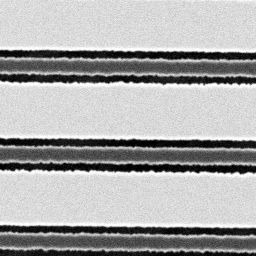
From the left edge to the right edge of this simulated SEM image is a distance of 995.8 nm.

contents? lines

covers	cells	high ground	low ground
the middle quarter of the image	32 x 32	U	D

UUUUUUUUUUUUUUUUUUUUUUUUUUUUUUUU
UUUUUUUUUUUUUUUUUUUUUUUUUUUUUUUU
UUDUUUUUUUUUUUUUUUUUUUUUUUUUUUUU
DDDDDDDDDDDDDDDDDDDDDDDDDDDDDDDD
DDDDDDDDDDDDDUUDDDDDDDDDDDDDDDDD
UUUUUUUUUUUUUUUUUUUUUUUUUUUUUUUU
UUUUUUUUUUUUUUUUUUUUUUUUUUUUUUUU
UUUUUUUUUUUUUUUUUUUUUUUUUUUUUUUU
UUUUUUUUUUUUUUUUUUUUUUUUUUUUUUUU
UUUUUUUUUUUUUUUUUUUUUUUUUUUUUUUU
UUUUUUUUUUUUUUUUUUUUUUUUUUUUUUUU
UUUUUUUUUUUUUUUUUUUUUUUUUUUUUUUU
UUUUUUUUUUUUUUUUUUUUUUUUUUUUUUUU
UUUUUUUUUUUUUUUUUUUUUUUUUUUUUUUU
UUUUUUUUUUUUUUUUUUUUUUUUUUUUUUUU
UUUUUUUUUUUUUUUUUUUUUUUUUUUUUUUU
UUUUUUUUUUUUUUUUUUUUUUUUUUUUUUUU
UUUUUUUUUUUUUUUUUUUUUUUUUUUUUUUU
DUUUUUUUUUUUUUUUUUUUUUUUUUUUUUUU
DDDDDDDDDDDDDDDDDDDDDDDDDDDDDDDD
DDDDDDDDDDDDDDDDDDDDDDDDDDDDDDDD
UUUUUUUUUUUUUUUUUUUUUUUUUUUUUUUU
UUUUUUUUUUUUUUUUUUUUUUUUUUUUUUUU
UUUUUUUUUUUUUUUUUUUUUUUUUUUUUUUU
UUUUUUUUUUUUUUUUUUUUUUUUUUUUUUUU
DDDDDDDDDDDDDDDDDDDDDDDDDDDDDDDD
DDDDDDDDDDDDDDDDDDDDDDDDDDDDDDDD
UUUUUUUUUUUUUUUUUUUUUUUUUUUUUUUU
UUUUUUUUUUUUUUUUUUUUUUUUUUUUUUUU
UUUUUUUUUUUUUUUUUUUUUUUUUUUUUUUU
UUUUUUUUUUUUUUUUUUUUUUUUUUUUUUUU
UUUUUUUUUUUUUUUUUUUUUUUUUUUUUUUU